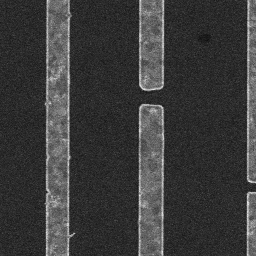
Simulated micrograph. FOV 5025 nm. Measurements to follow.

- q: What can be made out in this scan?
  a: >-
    one or a few lines or trenches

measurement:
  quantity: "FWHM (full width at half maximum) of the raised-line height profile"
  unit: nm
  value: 447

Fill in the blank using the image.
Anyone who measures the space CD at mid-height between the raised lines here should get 1.4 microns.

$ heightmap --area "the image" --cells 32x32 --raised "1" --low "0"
00000011100000000011000000000001
00000011100000000011000000000001
00000011100000000011000000000001
00000011100000000011000000000001
00000011100000000011000000000001
00000011100000000011000000000001
00000011100000000011000000000001
00000011100000000011000000000001
00000011100000000011000000000001
00000011100000000011000000000001
00000011100000000011000000000001
00000011100000000000000000000001
00000011100000000000000000000001
00000011100000000011000000000001
00000011100000000011000000000001
00000011000000000011000000000001
00000011000000000011000000000001
00000011000000000011000000000001
00000011000000000011000000000001
00000011100000000011000000000001
00000011000000000011000000000001
00000011000000000011000000000001
00000011000000000011000000000001
00000011000000000011000000000000
00000011000000000111000000000001
00000011000000000011000000000001
00000011000000000011000000000001
00000011000000000111000000000001
00000011000000000011000000000001
00000011100000000011000000000001
00000011000000000011000000000001
00000011000000000011000000000001